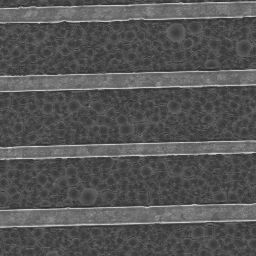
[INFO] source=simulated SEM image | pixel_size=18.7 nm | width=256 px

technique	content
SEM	one or a few lines or trenches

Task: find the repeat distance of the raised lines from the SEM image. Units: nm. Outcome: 1260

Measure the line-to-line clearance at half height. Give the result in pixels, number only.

53.2